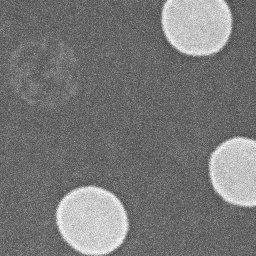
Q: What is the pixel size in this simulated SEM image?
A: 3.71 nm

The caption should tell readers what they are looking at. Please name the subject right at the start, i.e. raised bodies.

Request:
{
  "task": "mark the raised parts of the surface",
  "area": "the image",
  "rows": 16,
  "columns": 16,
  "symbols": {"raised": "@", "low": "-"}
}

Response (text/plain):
----------@@@@--
----------@@@@--
-----------@@@--
----------------
----------------
----------------
----------------
----------------
----------------
-------------@@@
-------------@@@
-------------@@@
----@@@-------@@
----@@@@--------
----@@@@--------
-----@@---------